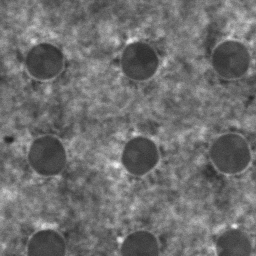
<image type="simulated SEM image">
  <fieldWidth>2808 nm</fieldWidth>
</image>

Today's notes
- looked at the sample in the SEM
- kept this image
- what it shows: raised bodies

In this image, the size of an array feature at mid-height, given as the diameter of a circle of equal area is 446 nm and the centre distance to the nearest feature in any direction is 1000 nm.